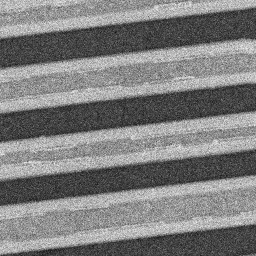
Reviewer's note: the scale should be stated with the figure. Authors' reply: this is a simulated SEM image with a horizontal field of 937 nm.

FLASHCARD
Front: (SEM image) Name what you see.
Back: one or a few lines or trenches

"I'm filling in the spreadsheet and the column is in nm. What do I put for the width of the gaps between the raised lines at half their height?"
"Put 154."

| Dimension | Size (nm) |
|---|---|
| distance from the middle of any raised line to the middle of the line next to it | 254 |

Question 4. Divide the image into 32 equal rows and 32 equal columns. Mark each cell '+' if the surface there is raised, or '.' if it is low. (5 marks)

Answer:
...++++++++++++++++++++++++++...
++++++++++++++++++++............
++++++++++++....................
++++............................
................................
................................
........................++++++++
................++++++++++++++++
.......+++++++++++++++++++++++++
++++++++++++++++++++++++++++++++
+++++++++++++++++++++++.........
+++++++++++++++.................
+++++++.........................
................................
................................
..........................++++++
..................++++++++++++++
.........+++++++++++++++++++++++
.+++++++++++++++++++++++++......
++++++++++++++++++..............
++++++++++......................
+...............................
................................
..........................++++++
..................++++++++++++++
.........+++++++++++++++++++++++
.+++++++++++++++++++++++++++++++
+++++++++++++++++++++++++++++...
+++++++++++++++++++++...........
++++++++++++....................
++++............................
................................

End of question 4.